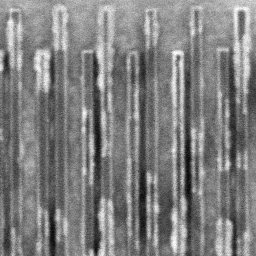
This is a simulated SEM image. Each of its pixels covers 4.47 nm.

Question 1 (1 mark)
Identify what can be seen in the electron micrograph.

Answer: parallel lines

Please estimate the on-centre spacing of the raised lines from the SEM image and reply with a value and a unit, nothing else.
22.6 pixels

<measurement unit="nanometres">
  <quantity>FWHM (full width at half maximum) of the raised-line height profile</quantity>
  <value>45.2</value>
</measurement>